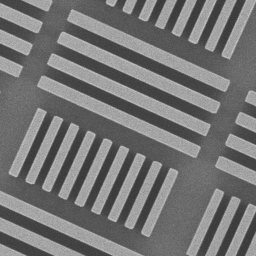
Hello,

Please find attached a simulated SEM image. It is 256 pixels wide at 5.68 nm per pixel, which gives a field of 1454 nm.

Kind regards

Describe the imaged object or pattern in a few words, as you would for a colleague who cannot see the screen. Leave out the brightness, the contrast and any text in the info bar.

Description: groups of lines, slits or small figures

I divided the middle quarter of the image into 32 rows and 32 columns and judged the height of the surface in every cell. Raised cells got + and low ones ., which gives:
++++.......++++++++.......++++++
++++++........+++++++.......++++
.+++++++........+++++++.......++
...++++++++.......+++++++.......
......+++++++.......++++++++....
........+++++++.......++++++++..
+++.......+++++++.......++++++++
+++++.......+++++++........+++++
+++++++.......+++++++........+++
..++++++++.......+++++++.......+
....++++++++.......+++++++......
......++++++++.......++++++++...
.........+++++++.......++++++++.
...........+++++++.......+++++++
.............+++++++........++++
..+............++++++++.......++
.+++.............++++++++.......
.++...+............++++++++.....
+++..+++..............+++++++...
++...++...++............+++++++.
++..+++..+++..............++++++
+...++...++...++............++++
+..+++..+++..+++..+............+
...++...++...++...++............
..+++..+++..+++..+++..+.........
..++...++...++...++...++........
.+++..+++..+++..+++..+++..++....
.+++..++...++...++...++...++....
.++...++..+++...++..+++..+++....
+++..+++..+++..+++..++...+++....
++...++...++...++..+++...++.....
++..+++..+++..+++..+++..+++.....